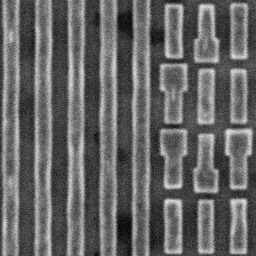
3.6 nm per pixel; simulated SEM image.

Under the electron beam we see wiring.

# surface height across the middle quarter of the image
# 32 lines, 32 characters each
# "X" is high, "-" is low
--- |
--XX-----XXXX----XXXX----XXXXX--
--XX-----XXXX-----XXX----XXXXX--
--XXX----XXXX-----XXX----XXXXX--
--XXX----XXXX-----XXX----XXXXX--
--XXX-----XXX-----XXX----XXXXX--
--XXX-----XXX-----XXX----XXXXX--
--XX------XXX-----XXX----XXXX---
--XX------XXX-----XXX-----XXX---
--XX------XXX-----XXX-----XXX---
--XXX-----XXX----XXXX-----XXX---
--XXX-----XXX----XXXX-----XXX---
--XXX----XXXX----XXXX-----XXX---
--XXX----XXXX-----XXX----XXXX---
--XXX----XXXX-----XXX----XXXX---
--XXX----XXXX-----XXX----XXXX---
--XXX----XXXX-----XXX-----------
-XXXX----XXXX-----XXX----XXXXX--
-XXXX----XXXX----XXXX---XXXXXXX-
-XXXX----XXXX----XXXX---XXXXXXX-
-XXX-----XXXX----XXXX---XXXXXX--
-XXX-----XXXX----XXXX---XXXXXX--
-XXX-----XXXX----XXXX---XXXXXX--
--XX-----XXXX----XXXX----XXXXX--
--XX-----XXXX----XXXX----XXXX---
--XX-----XXXX----XXXX----XXXX---
--XX------XXX----XXXX----XXXX---
--XX------XXX----XXXX----XXXX---
--XX------XXX----XXXX----XXXX---
--XXX-----XXX----XXXX----XXXX---
--XXX----XXXX----XXXX----XXXX---
--XXX----XXXX----XXXX----XXXX---
--XXX----XXXX----XXXX-----------